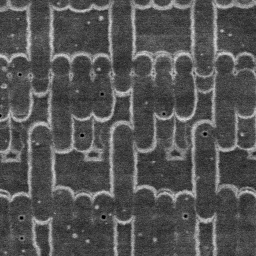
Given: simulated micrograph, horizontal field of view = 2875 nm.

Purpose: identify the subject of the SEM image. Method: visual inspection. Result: wiring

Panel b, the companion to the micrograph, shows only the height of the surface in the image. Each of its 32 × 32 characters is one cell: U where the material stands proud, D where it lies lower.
UUUUUUUUUUUUUUUUUUUUUUUUUUUUUDUD
DDDUUUDDDDDDDDUUUDDDDDDDUUUDDDDD
DDDDUUDDDDDDDDUUUDDDDDDDUUUDDDDD
DDDDUUDDDDDDDDUUUDDDDDDDUUUDDDDD
DDDDUUDDDDDDDDUUUDDDDDDDUUUDDDDD
DDDDUUDDDDDDDDUUUDDDDDDDUUUDDDDD
DDDDUUDDDDDDDDUUUDDDDDDDUUUDDDDD
UUUUUUUUUUUUUUUUUUUUUUUUUUUUUUUU
UUUUUUUUUUUUUUUUUUUUUUUUUUUUUUUU
UUUUUUUUUUUUUUUUUUUUUUUUDUDUUUUU
UUUUUUUUUUUUUUUUUUUUUUUUDDDUUUUU
UUUUUUUUUUUUUUUUUUUUUUUUDDDUUUUU
UUUUDDUUUUUUUUDDUUUUUUUUDDDUUUUU
UUUUDDUUUUUUUUDDUUUUUUUUDDDUUUUU
UUUDDDUUUUUUUUDDUUUUUUUUDDDUUUUD
DDDDDDUUUDDDDDDUUUUDDDDDDUUUUUDD
DDDDUUUUUDDDDDUUUUUDDDDDUUUUUUDD
DDDDUUUUUDDDDDUUUUUDDDDDUUUUUUDD
DDDDUUUUUDDDDDUUUUUDDDDDUUUUUDDD
DDDDUUUDDDDDDDUUUDDDDDDDUUUDDDDD
DDDDUUUDDDDDDDUUUDDDDDDDUUUDDDDD
DDDDUUUDDDDDDDUUUDDDDDDDUUUDDDDD
DDDDUUUDDDDDDDUUUDDDDDDDUUUDDDDD
DDDDUUUUDDDDDDUUUUUDDDDDUUUUUDDD
UDUUUUUUUUUDUUUUUUUUUDUUUUUUUUUU
UUUUUUUUUUUUUUUUUUUUUUUUUUUUUUUU
UUUUUUUUUUUUUUUUUUUUUUUUUUUUUUUU
UUUUUUUUUUUUUUUUUUUUUUUUUUUUUUUU
UUUUDDUUUUUUUUDDDUUUUUUUUDDUUUUU
UUUUDDUUUUUUUUDDDUUUUUUUUDDUUUUU
UUUUDDUUUUUUUUDDDUUUUUUUUDDUUUUU
UUUUUDUUUUUUUUDDDUUUUUUUUDDUUUUU